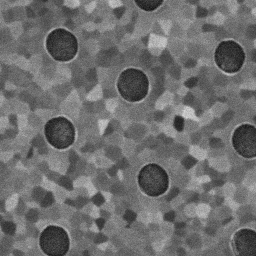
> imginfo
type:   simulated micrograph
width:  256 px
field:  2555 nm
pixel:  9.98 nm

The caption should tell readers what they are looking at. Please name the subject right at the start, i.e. holes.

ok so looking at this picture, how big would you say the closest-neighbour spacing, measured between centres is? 870 nanometres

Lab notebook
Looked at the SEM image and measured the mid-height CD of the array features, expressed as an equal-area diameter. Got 329 nm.